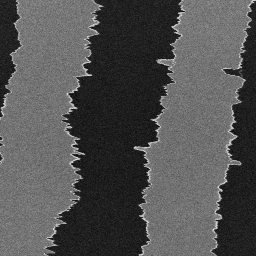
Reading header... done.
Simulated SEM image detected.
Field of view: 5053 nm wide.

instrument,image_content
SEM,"one or a few lines or trenches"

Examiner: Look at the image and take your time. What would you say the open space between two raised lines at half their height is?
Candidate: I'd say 1630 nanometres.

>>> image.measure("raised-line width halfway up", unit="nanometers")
1420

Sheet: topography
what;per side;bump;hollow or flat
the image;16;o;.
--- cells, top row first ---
.ooooo.....ooooo
.ooooo.....ooooo
.ooooo.....oooo.
.ooooo.....oooo.
.oooo......oooo.
ooooo......oooo.
ooooo.....ooooo.
oooo......ooooo.
oooo......ooooo.
ooooo....ooooo..
ooooo....ooooo..
ooooo....ooooo..
ooooo....ooooo..
oooo.....ooooo..
ooo......oooo...
ooo......oooo...